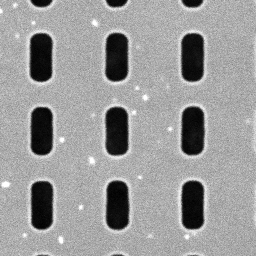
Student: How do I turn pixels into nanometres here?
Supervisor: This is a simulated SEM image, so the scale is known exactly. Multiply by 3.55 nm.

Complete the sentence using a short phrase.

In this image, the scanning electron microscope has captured a regular array of holes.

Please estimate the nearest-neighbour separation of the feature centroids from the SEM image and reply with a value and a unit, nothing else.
261 nm